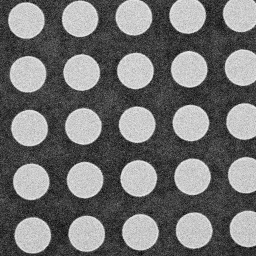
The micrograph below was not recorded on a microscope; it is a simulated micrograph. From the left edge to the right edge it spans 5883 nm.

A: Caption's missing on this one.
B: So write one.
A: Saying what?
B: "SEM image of an array of small figures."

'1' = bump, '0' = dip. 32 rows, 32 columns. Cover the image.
00110000011000011100001110001111
01111000111100011110011111001111
01111000111100011110011111001111
01111000111100011100001110000110
00110000011000000000000000000000
00000000000000000000000000000000
00000000000000000000000100000110
00111000011100011110001111001111
01111100111100011110011111001111
01111100111100011110001111001111
00111000011100011100001110000010
00000000000000000000000000000000
00000000000000000000000000000000
00000000000000001100000110000111
00111000011100011110001111001111
00111100111110011110001111001111
00111100111110011110001111000111
00111000011100001100000100000000
00000000000000000000000000000000
00000000000000000000000000000000
00000000001000001110000110000111
00111100011110011110001111000111
00111100111110011111001111000111
00111100011110001110001111000111
00011000001000000100000000000000
00000000000000000000000000000000
00000000000000000000000000000011
00011000001100001110000111000111
00111100011110011111001111000111
00111100011110011111001111000111
00111100011110001110000111000011
00011000000000000000000000000000